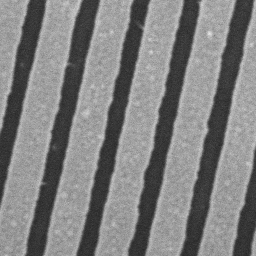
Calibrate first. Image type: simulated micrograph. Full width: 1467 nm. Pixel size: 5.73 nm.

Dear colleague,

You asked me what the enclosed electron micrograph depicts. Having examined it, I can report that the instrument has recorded lines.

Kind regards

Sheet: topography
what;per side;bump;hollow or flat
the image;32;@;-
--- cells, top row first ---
@@@---@@@@--@@@@---@@@@--@@@@---
@@@---@@@@--@@@@--@@@@@--@@@@---
@@@--@@@@---@@@@--@@@@---@@@@--@
@@@--@@@@---@@@@--@@@@---@@@@--@
@@@--@@@@---@@@@--@@@@--@@@@---@
@@---@@@@--@@@@---@@@@--@@@@---@
@@---@@@@--@@@@--@@@@---@@@@---@
@@--@@@@---@@@@--@@@@---@@@@--@@
@@--@@@@---@@@@--@@@@--@@@@@--@@
@@--@@@@--@@@@@--@@@@--@@@@---@@
@---@@@@--@@@@--@@@@@--@@@@---@@
@--@@@@@--@@@@--@@@@@--@@@@--@@@
@--@@@@---@@@@--@@@@---@@@@--@@@
@--@@@@---@@@@--@@@@--@@@@---@@@
---@@@@--@@@@---@@@@--@@@@---@@@
--@@@@@--@@@@--@@@@@--@@@@---@@@
--@@@@---@@@@--@@@@---@@@@--@@@@
--@@@@---@@@@--@@@@--@@@@---@@@@
--@@@@--@@@@@--@@@@--@@@@---@@@@
--@@@@--@@@@---@@@@--@@@@---@@@@
-@@@@@--@@@@--@@@@---@@@@--@@@@@
-@@@@---@@@@--@@@@---@@@@--@@@@-
-@@@@---@@@@--@@@@--@@@@@--@@@@-
-@@@@--@@@@---@@@@--@@@@---@@@@-
@@@@@--@@@@--@@@@---@@@@--@@@@@-
@@@@---@@@@--@@@@---@@@@--@@@@--
@@@@---@@@@--@@@@--@@@@@--@@@@--
@@@@--@@@@@--@@@@--@@@@---@@@@--
@@@@--@@@@---@@@@--@@@@---@@@@--
@@@@--@@@@--@@@@@--@@@@--@@@@@--
@@@---@@@@--@@@@---@@@@--@@@@---
@@@---@@@@--@@@@--@@@@@--@@@@--@